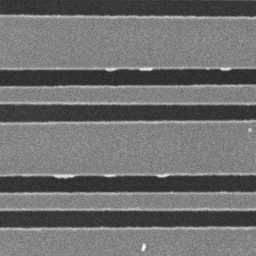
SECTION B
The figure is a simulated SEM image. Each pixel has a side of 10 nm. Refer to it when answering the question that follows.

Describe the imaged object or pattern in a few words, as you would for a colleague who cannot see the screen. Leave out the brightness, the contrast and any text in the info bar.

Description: lines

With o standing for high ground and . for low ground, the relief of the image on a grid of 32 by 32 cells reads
................................
................................
oooooooooooooooooooooooooooooooo
oooooooooooooooooooooooooooooooo
oooooooooooooooooooooooooooooooo
oooooooooooooooooooooooooooooooo
oooooooooooooooooooooooooooooooo
oooooooooooooooooooooooooooooooo
oooooooooooooooooooooooooooooooo
................................
................................
oooooooooooooooooooooooooooooooo
oooooooooooooooooooooooooooooooo
................................
................................
oooooooooooooooooooooooooooooooo
oooooooooooooooooooooooooooooooo
oooooooooooooooooooooooooooooooo
oooooooooooooooooooooooooooooooo
oooooooooooooooooooooooooooooooo
oooooooooooooooooooooooooooooooo
oooooooooooooooooooooooooooooooo
................................
................................
oooooooooooooooooooooooooooooooo
oooooooooooooooooooooooooooooooo
................................
................................
............o...oo.ooooooooooooo
oooooooooooooooooooooooooooooooo
oooooooooooooooooooooooooooooooo
oooooooooooooooooooooooooooooooo